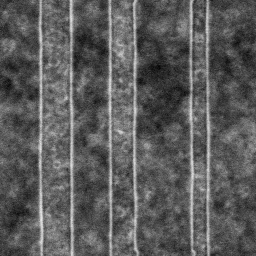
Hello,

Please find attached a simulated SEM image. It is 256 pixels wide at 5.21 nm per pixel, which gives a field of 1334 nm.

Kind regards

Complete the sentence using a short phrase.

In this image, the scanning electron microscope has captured one or a few lines or trenches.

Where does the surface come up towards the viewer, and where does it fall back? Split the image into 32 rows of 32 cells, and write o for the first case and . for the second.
ooooo....ooooo...ooooooo..oooooo
ooooo....ooooo...ooooooo..oooooo
ooooo....ooooo...ooooooo..oooooo
ooooo....ooooo...ooooooo..oooooo
ooooo....ooooo...ooooooo..oooooo
ooooo....ooooo...ooooooo..oooooo
ooooo....ooooo...ooooooo..oooooo
ooooo....ooooo...ooooooo..oooooo
ooooo....ooooo...ooooooo..oooooo
ooooo....ooooo...ooooooo..oooooo
ooooo....ooooo...ooooooo..oooooo
ooooo....ooooo...ooooooo..oooooo
ooooo....ooooo...ooooooo..oooooo
ooooo....ooooo...ooooooo..oooooo
ooooo....ooooo...ooooooo..oooooo
ooooo....ooooo...ooooooo..oooooo
ooooo....ooooo...ooooooo..oooooo
ooooo....ooooo...ooooooo..oooooo
ooooo....ooooo...ooooooo..oooooo
ooooo....ooooo...ooooooo..oooooo
ooooo....ooooo...ooooooo..oooooo
ooooo....ooooo...ooooooo..oooooo
ooooo....ooooo...ooooooo..oooooo
ooooo....ooooo...ooooooo..oooooo
ooooo....ooooo...ooooooo..oooooo
ooooo....ooooo...ooooooo..oooooo
ooooo....ooooo...ooooooo..oooooo
ooooo....ooooo...ooooooo..oooooo
ooooo....ooooo...ooooooo..oooooo
ooooo....ooooo...ooooooo..oooooo
ooooo....ooooo...ooooooo..oooooo
ooooo....ooooo...ooooooo..oooooo